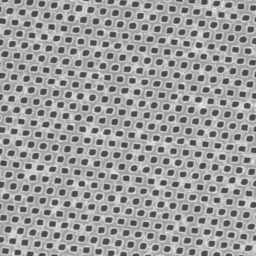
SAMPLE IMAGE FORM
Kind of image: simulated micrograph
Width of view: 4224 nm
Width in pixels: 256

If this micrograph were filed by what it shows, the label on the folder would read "a regular array of holes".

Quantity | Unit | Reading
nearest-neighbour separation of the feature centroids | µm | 0.2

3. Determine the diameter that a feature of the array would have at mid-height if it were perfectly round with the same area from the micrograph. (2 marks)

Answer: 119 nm